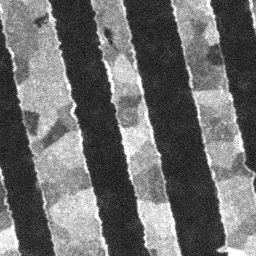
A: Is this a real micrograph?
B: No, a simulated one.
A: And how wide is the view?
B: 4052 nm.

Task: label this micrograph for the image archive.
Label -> one or a few lines or trenches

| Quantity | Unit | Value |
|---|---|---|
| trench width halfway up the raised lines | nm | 668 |